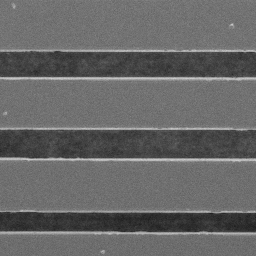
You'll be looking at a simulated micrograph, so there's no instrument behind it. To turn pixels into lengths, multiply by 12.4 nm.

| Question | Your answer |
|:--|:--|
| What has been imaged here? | lines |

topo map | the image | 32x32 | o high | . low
oooooooooooooooooooooooooooooooo
oooooooooooooooooooooooooooooooo
oooooooooooooooooooooooooooooooo
oooooooooooooooooooooooooooooooo
oooooooooooooooooooooooooooooooo
oooooooooooooooooooooooooooooooo
................................
................................
................................
................................
oooooooooooooooooooooooooooooooo
oooooooooooooooooooooooooooooooo
oooooooooooooooooooooooooooooooo
oooooooooooooooooooooooooooooooo
oooooooooooooooooooooooooooooooo
oooooooooooooooooooooooooooooooo
................................
................................
................................
................................
oooooooooooooooooooooooooooooooo
oooooooooooooooooooooooooooooooo
oooooooooooooooooooooooooooooooo
oooooooooooooooooooooooooooooooo
oooooooooooooooooooooooooooooooo
oooooooooooooooooooooooooooooooo
..........o..ooo..oooooooooooooo
................................
................................
oooooooooooooooooooooooooooooooo
oooooooooooooooooooooooooooooooo
oooooooooooooooooooooooooooooooo